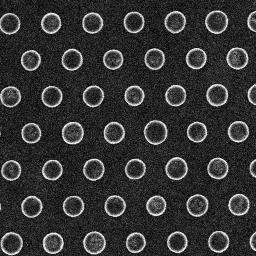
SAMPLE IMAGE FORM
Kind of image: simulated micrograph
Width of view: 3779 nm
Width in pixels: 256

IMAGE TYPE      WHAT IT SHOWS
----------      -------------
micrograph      a regular array of raised bodies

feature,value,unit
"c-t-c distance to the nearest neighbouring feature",610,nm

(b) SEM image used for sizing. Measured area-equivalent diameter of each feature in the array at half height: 0.296 µm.